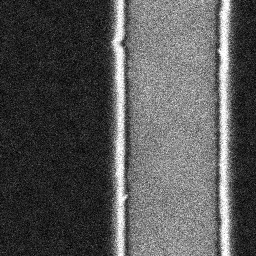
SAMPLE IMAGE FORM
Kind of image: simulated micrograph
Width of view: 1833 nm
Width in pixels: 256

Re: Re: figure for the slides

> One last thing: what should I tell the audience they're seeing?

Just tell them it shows one or a few lines or trenches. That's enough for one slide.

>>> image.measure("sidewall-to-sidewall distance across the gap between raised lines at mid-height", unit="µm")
0.724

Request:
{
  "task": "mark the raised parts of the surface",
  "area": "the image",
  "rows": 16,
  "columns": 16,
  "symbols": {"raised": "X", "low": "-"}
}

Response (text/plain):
XXXXXXXX------XX
XXXXXXXX------XX
XXXXXXX-------XX
XXXXXXXX------XX
XXXXXXXX------XX
XXXXXXXX------XX
XXXXXXXX------XX
XXXXXXXX------XX
XXXXXXXX------XX
XXXXXXXX------XX
XXXXXXXX------XX
XXXXXXXX------XX
XXXXXXXX------XX
XXXXXXXX------XX
XXXXXXXX------XX
XXXXXXXX------XX